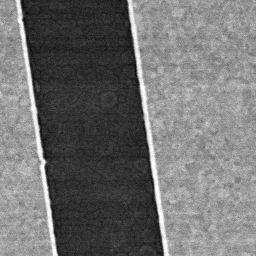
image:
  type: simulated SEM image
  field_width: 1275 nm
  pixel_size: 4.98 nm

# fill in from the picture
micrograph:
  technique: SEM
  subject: one or a few lines or trenches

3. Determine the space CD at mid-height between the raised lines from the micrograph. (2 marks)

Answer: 550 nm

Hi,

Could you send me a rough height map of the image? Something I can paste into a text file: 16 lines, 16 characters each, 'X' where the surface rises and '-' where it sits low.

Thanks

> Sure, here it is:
X-------XXXXXXXX
X-------XXXXXXXX
X-------XXXXXXXX
XX-------XXXXXXX
XX-------XXXXXXX
XX-------XXXXXXX
XX-------XXXXXXX
XX-------XXXXXXX
XX-------XXXXXXX
XX-------XXXXXXX
XXX-------XXXXXX
XXX-------XXXXXX
XXX-------XXXXXX
XXX-------XXXXXX
XXX-------XXXXXX
XXX-------XXXXXX